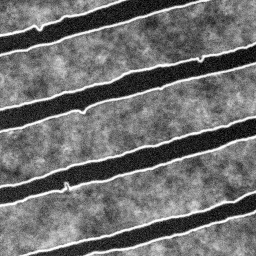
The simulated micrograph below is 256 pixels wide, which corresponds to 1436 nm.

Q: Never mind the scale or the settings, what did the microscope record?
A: one or a few lines or trenches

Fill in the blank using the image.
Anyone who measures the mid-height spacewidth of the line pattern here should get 297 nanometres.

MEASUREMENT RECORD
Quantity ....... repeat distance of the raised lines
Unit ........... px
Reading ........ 72.5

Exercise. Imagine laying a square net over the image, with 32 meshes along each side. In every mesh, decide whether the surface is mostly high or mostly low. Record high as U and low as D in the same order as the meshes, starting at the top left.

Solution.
DDDDDDDDDDDDDDUUUUUUUUUUDDDDDDDD
DDDDDDDDDDDUUUUUUUUUDDDDDDDDDDDD
DDDDDDDUUUUUUUUUUDDDDDDDDDDDDDDD
DDDDUUUUUUUUUDDDDDDDDDDDDDDDDDDD
UUUUUUUUUDDDDDDDDDDDDDDDDDDDDDDD
UUUUUUDDDDDDDDDDDDDDDDDDDDDDDDDD
UUDDDDDDDDDDDDDDDDDDDDDDDDDDUUUU
DDDDDDDDDDDDDDDDDDDDDDDDUUUUUUUU
DDDDDDDDDDDDDDDDDDDUUUUUUUUUUUDD
DDDDDDDDDDDDDDDUUUUUUUUUUUDDDDDD
DDDDDDDDDDDDUUUUUUUUUUDDDDDDDDDD
DDDDDDDDUUUUUUUUUUDDDDDDDDDDDDDD
DDDDDUUUUUUUUUDDDDDDDDDDDDDDDDDD
DUUUUUUUUUUDDDDDDDDDDDDDDDDDDDDD
UUUUUUUDDDDDDDDDDDDDDDDDDDDDDDDD
UUUUDDDDDDDDDDDDDDDDDDDDDDDDDUUU
DDDDDDDDDDDDDDDDDDDDDDDDDUUUUUUU
DDDDDDDDDDDDDDDDDDDDDUUUUUUUUUUD
DDDDDDDDDDDDDDDDDUUUUUUUUUUUDDDD
DDDDDDDDDDDDDDDUUUUUUUUUDDDDDDDD
DDDDDDDDDDUUUUUUUUUUUDDDDDDDDDDD
DDDDDDDUUUUUUUUUUDDDDDDDDDDDDDDD
DDDDUUUUUUUUUUDDDDDDDDDDDDDDDDDD
UUUUUUUUDDDDDDDDDDDDDDDDDDDDDDDD
UUUUUDDDDDDDDDDDDDDDDDDDDDDDDDDU
UUDDDDDDDDDDDDDDDDDDDDDDDDDUUUUU
DDDDDDDDDDDDDDDDDDDDDDDDUUUUUUUU
DDDDDDDDDDDDDDDDDDDDUUUUUUUUDDDD
DDDDDDDDDDDDDDDDDUUUUUUUUDDDDDDD
DDDDDDDDDDDDDUUUUUUUUUDDDDDDDDDD
DDDDDDDDDUUUUUUUUUDDDDDDDDDDDDDD
DDDDUUUUUUUUUDDDDDDDDDDDDDDDDDDD